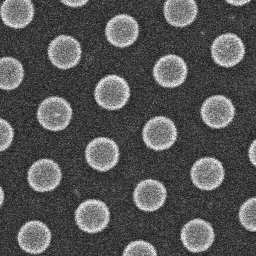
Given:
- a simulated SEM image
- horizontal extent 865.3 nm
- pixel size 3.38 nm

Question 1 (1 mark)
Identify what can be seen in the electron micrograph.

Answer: a regular array of raised bodies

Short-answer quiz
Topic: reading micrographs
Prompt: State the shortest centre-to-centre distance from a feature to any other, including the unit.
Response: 207 nanometres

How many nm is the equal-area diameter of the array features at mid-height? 105